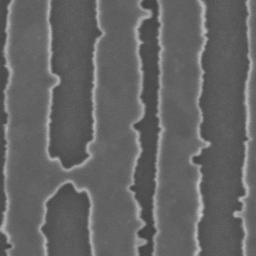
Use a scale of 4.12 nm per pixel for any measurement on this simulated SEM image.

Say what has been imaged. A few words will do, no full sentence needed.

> one or a few lines or trenches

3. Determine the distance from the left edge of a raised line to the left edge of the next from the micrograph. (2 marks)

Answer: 312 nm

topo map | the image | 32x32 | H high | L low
LHHHHHLLLLLLHHHHHLLLHHHHHLLLLLLH
LHHHHHLLLLLLHHHHHHHLHHHHHHLLLLLH
LHHHHHLLLLLLHHHHHHLLHHHHHLLLLLLH
LHHHHHLLLLLLHHHHHLLLHHHHHLLLLLLH
LHHHHHLLLLLLLHHHHLLLHHHHHHLLLLLH
LHHHHHLLLLLLHHHHHLLLHHHHHHLLLLLH
LHHHHHLLLLLLHHHHHLLLHHHHHLLLLLLH
LHHHHHLLLLLLHHHHHLLLHHHHHLLLLLLH
LHHHHHLLLLLLHHHHHHLLHHHHHLLLLLLH
LHHHHHHLLLLLHHHHHHLLHHHHHLLLLLLH
LHHHHHHLLLLLHHHHHHLLHHHHHLLLLLLH
LHHHHHLLLLLLHHHHHHLLHHHHHLLLLLLH
LHHHHHLLLLLLHHHHHHLLHHHHHLLLLLLH
LHHHHHLLLLLLHHHHHHLLHHHHHLLLLLLH
LHHHHHLLLLLLHHHHHHLLHHHHHLLLLLLH
LHHHHHLLLLLLHHHHHLLLHHHHHLLLLLLH
LHHHHHLLLLLLHHHHHLLLHHHHHLLLLLLH
LHHHHHLLLLLLHHHHHLLLHHHHHLLLLLLH
LHHHHHLLLLLHHHHHHHLLHHHHHHLLLLLH
LHHHHHLLLLLHHHHHHLLLHHHHLLLLLLLH
LHHHHHHHLLHHHHHHHLLLHHHHLLLLLLLH
LHHHHHHHHHHHHHHHHLLLHHHHHLLLLLLH
LHHHHHHHHHHHHHHHHLLLHHHHHLLLLLHH
LHHHHHHLLHHHHHHHLLLLHHHHHLLLLLLH
LHHHHHLLLLLHHHHHHLLHHHHHHLLLLLLH
LHHHHHLLLLLHHHHHHLLHHHHHHLLLLLHH
LHHHHHLLLLLHHHHHHLLHHHHHHLLLLLHH
LHHHHLLLLLLHHHHHHHLHHHHHHLLLLLHH
HHHHHLLLLLLHHHHHHHLHHHHHHLLLLLLH
LHHHHHLLLLLHHHHHHLLHHHHHHLLLLLLH
LHHHHHLLLLLHHHHHHHLHHHHHHLLLLLHH
LHHHHHLLLLLHHHHHHLLHHHHHHLLLLLHH